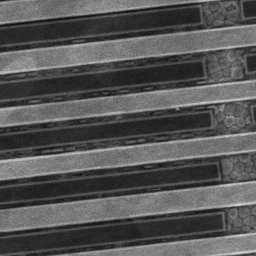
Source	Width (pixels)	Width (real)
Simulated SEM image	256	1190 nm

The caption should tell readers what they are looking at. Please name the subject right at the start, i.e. parallel lines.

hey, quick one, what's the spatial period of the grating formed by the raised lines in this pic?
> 26 px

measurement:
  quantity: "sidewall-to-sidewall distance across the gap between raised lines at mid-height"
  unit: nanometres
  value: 33.8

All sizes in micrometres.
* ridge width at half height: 0.086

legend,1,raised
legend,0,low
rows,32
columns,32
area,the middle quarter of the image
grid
11000000000000000000000111111111
00000000000000111111111111111111
00000111111111111111111111111111
11111111111111111111111111111111
11111111111111111111111111100000
11111111111111111100000000000000
11111111100000000000000000001111
00000000000000000001111111111111
00000000001111111111111111111111
00111111111111111111111111111111
11111111111111111111111111111100
11111111111111111111100000000000
11111111111110000000000000000001
11110000000000000000011111111111
00000000000000111111111111111111
00011111111111111111111111111111
11111111111111111111111111111110
11111111111111111111111000000000
11111111111111000000000000000000
11111000000000000000000000111111
00000000000000000001111111111111
00000000001111111111111111111111
01111111111111111111111111111111
11111111111111111111111111111111
11111111111111111111111000000000
11111111111111100000000000000001
11111000000000000000001111111111
00000000000001111111111111111111
00000111111111111111111111111111
11111111111111111111111111111111
11111111111111111111111110000000
11111111111111110000000000000011